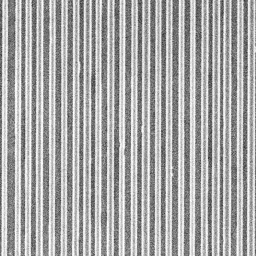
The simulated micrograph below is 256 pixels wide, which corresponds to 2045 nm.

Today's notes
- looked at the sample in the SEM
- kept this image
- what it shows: parallel lines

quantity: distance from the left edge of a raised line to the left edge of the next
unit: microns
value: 0.0938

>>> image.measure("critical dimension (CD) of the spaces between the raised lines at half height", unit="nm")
44.9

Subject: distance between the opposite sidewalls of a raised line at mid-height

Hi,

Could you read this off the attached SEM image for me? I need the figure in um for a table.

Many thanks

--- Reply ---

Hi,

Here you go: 0.0439